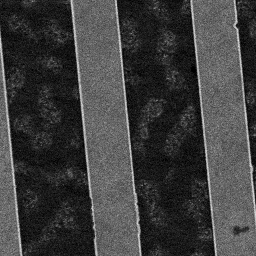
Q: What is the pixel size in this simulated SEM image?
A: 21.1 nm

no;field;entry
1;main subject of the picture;one or a few lines or trenches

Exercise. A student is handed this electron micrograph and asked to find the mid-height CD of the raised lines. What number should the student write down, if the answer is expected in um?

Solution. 0.922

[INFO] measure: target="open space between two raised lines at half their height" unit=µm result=1.58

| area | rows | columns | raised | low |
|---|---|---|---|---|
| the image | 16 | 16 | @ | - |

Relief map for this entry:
----@@@-----@@@-
-----@@-----@@@-
-----@@-----@@@-
-----@@@----@@@-
-----@@@----@@@-
-----@@@----@@@-
-----@@@-----@@-
-----@@@-----@@-
@----@@@-----@@-
@----@@@-----@@@
@----@@@-----@@@
@-----@@-----@@@
@-----@@@----@@@
@-----@@@----@@@
@-----@@@----@@@
@-----@@@----@@@